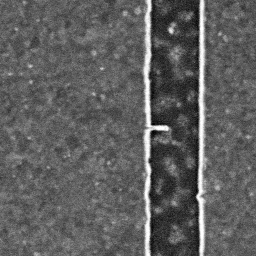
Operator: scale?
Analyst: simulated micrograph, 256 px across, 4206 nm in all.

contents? one or a few lines or trenches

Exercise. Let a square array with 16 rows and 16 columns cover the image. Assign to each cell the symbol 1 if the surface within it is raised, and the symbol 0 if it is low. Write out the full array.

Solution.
1111111110000111
1111111110000111
1111111110000111
1111111110000111
1111111110000111
1111111110000111
1111111110000111
1111111110000111
1111111110000111
1111111110000111
1111111110000111
1111111110000111
1111111110001111
1111111110000111
1111111110000111
1111111110000111